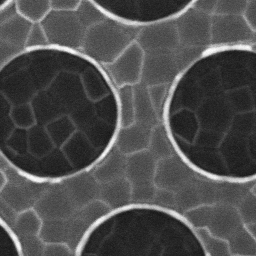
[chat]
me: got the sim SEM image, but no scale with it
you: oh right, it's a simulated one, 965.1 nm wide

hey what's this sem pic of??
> holes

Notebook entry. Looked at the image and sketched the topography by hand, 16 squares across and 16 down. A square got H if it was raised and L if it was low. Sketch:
HHHHHHLLLLLHHHHH
HHHHHHHHHHHHHHHH
HHHHHHHHHHHHHHHH
HLLLLHHHHHHHHLLL
LLLLLLHHHHHHLLLL
LLLLLLLHHHHLLLLL
LLLLLLLHHHHLLLLL
LLLLLLLHHHHLLLLL
LLLLLLLHHHHLLLLL
LLLLLLHHHHHLLLLL
HLLLLHHHHHHHLLLL
HHHHHHHHHHHHHHHH
HHHHHHHHHHHHHHHH
HHHHHHHLLLLHHHHH
HHHHHHLLLLLLHHHH
LHHHHLLLLLLLLHHH